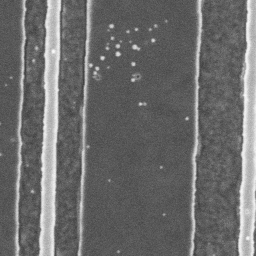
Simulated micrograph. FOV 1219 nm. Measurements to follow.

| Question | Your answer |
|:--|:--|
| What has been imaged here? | lines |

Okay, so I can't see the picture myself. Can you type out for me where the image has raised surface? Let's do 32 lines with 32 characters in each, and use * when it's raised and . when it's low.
***...**...**************......*
***...**...**************......*
***...*....**************......*
***...*....**************......*
***...*....**************......*
***...*....**************......*
***...*....**************......*
***...*....**************......*
***...*....**************......*
***...*....**************......*
***...*....**************......*
***...*....**************......*
***...*....**************......*
***...*...***************......*
***...*...***************......*
***..**...***************......*
**....*...***************......*
***..**...***************......*
***..**...***************.....**
***..**...**************......**
***..**...**************......**
**...**...**************......**
**...**...**************......**
**...**...**************......**
**...**...**************......**
**...**...**************......**
**...**...**************......**
**...**...**************......**
**...**...**************......**
**...**...**************......**
**...**...**************......**
**...**...**************......**